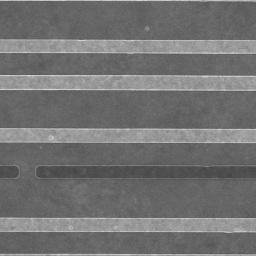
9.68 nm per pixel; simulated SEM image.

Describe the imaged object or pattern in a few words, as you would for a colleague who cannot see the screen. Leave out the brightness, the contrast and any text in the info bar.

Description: parallel lines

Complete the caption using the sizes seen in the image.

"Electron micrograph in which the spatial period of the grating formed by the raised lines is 432 nm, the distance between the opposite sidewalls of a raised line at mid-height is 133 nm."